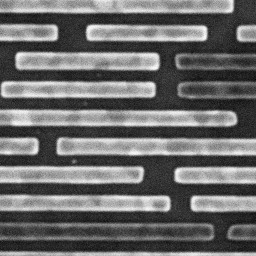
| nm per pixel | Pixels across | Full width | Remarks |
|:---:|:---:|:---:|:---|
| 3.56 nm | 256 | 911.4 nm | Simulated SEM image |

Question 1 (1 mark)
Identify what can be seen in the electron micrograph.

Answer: wiring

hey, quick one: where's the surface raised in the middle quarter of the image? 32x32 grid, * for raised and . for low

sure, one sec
************************....****
................................
................................
................................
................................
***********************......***
***********************......***
***********************......***
................................
................................
................................
................................
********************************
********************************
********************************
................................
................................
................................
................................
********************************
********************************
********************************
********************************
................................
................................
................................
********************........****
********************........****
*******************.........****
*******************..........***
................................
................................